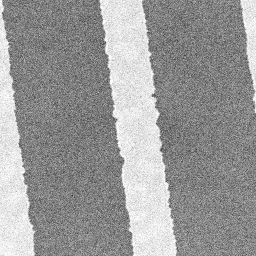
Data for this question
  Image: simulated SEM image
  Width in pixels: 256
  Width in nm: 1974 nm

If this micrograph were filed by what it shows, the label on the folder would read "one or a few lines or trenches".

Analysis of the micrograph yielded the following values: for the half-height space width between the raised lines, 99.1 px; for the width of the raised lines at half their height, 0.319 micrometres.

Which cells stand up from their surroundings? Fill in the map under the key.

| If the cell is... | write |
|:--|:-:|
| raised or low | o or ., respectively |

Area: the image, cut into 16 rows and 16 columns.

......ooo......o
.......oo......o
.......oo......o
o......oo......o
o......oo.......
o......ooo......
o......ooo......
o......ooo......
o......ooo......
o.......oo......
o.......oo......
oo......oo......
oo......ooo.....
oo......ooo.....
oo......ooo.....
oo......ooo.....